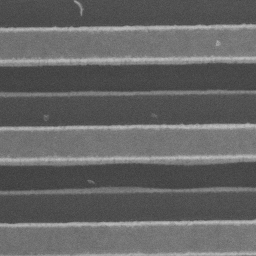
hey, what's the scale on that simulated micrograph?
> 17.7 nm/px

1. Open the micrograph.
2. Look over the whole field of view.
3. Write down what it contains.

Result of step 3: lines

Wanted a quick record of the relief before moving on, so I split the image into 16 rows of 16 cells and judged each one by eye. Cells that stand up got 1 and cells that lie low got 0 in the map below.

0000000000000000
0000000000000000
1111111111111111
1111111111111111
0000000000000000
0000000000000000
0000000000000000
0000000000000000
1111111111111111
1111111111111111
0000000000000000
0000000000000000
0000000000000000
0000000000000000
1111111111111111
1111111111111111